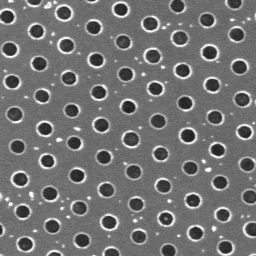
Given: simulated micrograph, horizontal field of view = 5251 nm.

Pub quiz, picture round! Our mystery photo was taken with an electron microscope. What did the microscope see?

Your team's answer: a regular array of holes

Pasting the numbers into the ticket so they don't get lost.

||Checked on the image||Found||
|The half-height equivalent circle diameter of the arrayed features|14.4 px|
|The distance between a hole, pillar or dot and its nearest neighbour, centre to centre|666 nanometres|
